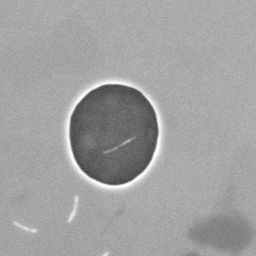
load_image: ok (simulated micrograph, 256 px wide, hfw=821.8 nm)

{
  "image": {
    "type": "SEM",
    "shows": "holes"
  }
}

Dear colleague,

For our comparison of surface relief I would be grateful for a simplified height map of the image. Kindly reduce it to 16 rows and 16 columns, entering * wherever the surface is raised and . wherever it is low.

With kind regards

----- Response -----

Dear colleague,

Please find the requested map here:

****************
****************
****************
****************
****************
******..********
*****....*******
****......******
****......******
****......******
*****....*******
******..********
****************
****************
****************
****************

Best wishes